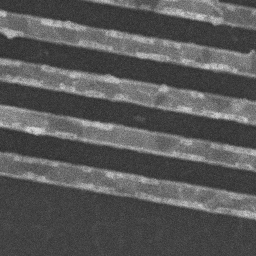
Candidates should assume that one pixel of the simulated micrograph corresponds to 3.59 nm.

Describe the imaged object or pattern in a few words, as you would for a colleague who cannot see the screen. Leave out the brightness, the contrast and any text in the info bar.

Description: parallel lines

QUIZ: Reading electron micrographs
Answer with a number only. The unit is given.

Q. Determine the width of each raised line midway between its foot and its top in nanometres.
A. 70.3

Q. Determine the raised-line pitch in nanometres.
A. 167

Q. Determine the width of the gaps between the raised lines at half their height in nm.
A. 98.3